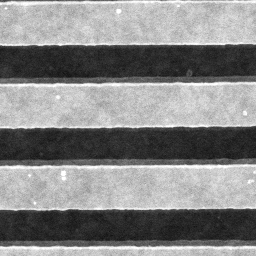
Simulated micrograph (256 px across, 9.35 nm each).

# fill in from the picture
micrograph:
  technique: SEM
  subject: lines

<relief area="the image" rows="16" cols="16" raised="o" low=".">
oooooooooooooooo
oooooooooooooooo
oooooooooooooooo
................
................
oooooooooooooooo
oooooooooooooooo
oooooooooooooooo
................
................
oooooooooooooooo
oooooooooooooooo
oooooooooooooooo
................
................
oooooooooooooooo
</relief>